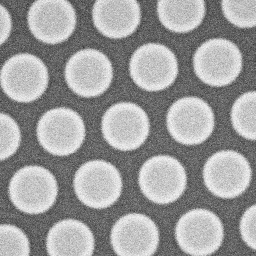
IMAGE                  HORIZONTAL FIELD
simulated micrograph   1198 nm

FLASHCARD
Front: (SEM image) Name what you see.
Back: an array of small figures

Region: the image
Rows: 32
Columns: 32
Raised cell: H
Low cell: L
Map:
LLLLHHHHHLLLHHHHHLLLHHHHHLLLHHHH
HLLLHHHHHLLLHHHHHLLLHHHHHLLLHHHH
HLLLHHHHHLLLHHHHHLLLHHHHHLLLLHHH
HLLLHHHHHLLLHHHHHLLLLHHHLLLLLLLL
HLLLHHHHHLLLLHHHLLLLLLLLLLLLLLLL
LLLLLLLLLLLLLLLLLLLLLLLLLLHHHLLL
LLLLLLLLLLHHLLLLLHHHHLLLLHHHHHLL
LHHHHLLLLHHHHLLLHHHHHHLLHHHHHHLL
HHHHHHLLHHHHHHLLHHHHHHLLHHHHHHLL
HHHHHHLLHHHHHHLLHHHHHHLLLHHHHHLL
HHHHHHLLLHHHHHLLLHHHHLLLLLHHLLLL
LHHHHLLLLHHHHLLLLLLLLLLLLLLLLLLL
LLHHLLLLLLLLLLLLLLLLLLHHHLLLLLHH
LLLLLLLLLLLLLLHHHLLLLHHHHHLLLHHH
HLLLLHHHHHLLLHHHHHLLLHHHHHHLLHHH
HHLLLHHHHHLLLHHHHHHLLHHHHHHLLHHH
HHLLLHHHHHLLLHHHHHLLLHHHHHLLLLHH
HHLLLHHHHHLLLHHHHHLLLLHHHLLLLLLL
HHLLLLHHHHLLLLLHHLLLLLLLLLLLLLLL
HLLLLLLLLLLLLLLLLLLLLLLLLLLHHHLL
LLLLLLLLLLLHHHLLLLHHHHLLLLHHHHHL
LLHHHHLLLLHHHHHLLLHHHHHLLLHHHHHL
LHHHHHHLLHHHHHHLLHHHHHHLLLHHHHHL
LHHHHHHLLHHHHHHLLLHHHHHLLLHHHHHL
LHHHHHHLLLHHHHHLLLHHHHLLLLLHHLLL
LLHHHHLLLLLHHHLLLLLLLLLLLLLLLLLL
LLLHHLLLLLLLLLLLLLLLLLLLHHLLLLLH
LLLLLLLLLLLLLLLHHHHLLLHHHHHLLLHH
HHLLLLLHHHHLLLHHHHHHLLHHHHHHLLHH
HHHLLLHHHHHHLLHHHHHHLLHHHHHHLLHH
HHHHLLHHHHHHLLHHHHHHLLHHHHHLLLLH
HHHHLLHHHHHLLLLHHHHLLLLHHHHLLLLL